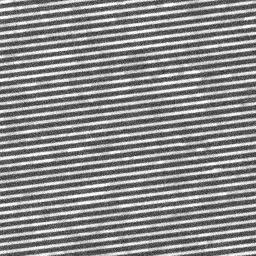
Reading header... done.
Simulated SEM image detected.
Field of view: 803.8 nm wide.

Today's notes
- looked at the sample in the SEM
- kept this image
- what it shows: parallel lines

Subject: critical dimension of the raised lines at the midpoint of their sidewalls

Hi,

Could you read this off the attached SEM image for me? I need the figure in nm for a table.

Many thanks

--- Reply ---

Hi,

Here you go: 8.5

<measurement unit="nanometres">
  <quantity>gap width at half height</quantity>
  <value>16.7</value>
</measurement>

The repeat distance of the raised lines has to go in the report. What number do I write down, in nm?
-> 24.3